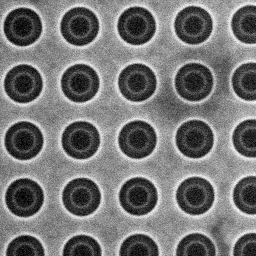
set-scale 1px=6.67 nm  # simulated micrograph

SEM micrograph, an array of small figures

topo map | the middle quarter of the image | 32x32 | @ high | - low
@------@@@@@@@@@-----@@@@@@@@---
--------@@@@@@--------@@@@@@@---
--@@@@---@@@@@---@@@---@@@@@---@
--@@@@---@@@@---@@@@@--@@@@@--@@
-@@@@@@--@@@@---@@@@@--@@@@---@@
-@@@@@@--@@@@---@@@@@--@@@@@--@@
--@@@@---@@@@@--@@@@---@@@@@---@
---@@---@@@@@@--------@@@@@@----
@------@@@@@@@@------@@@@@@@@---
@@----@@@@@@@@@@@--@@@@@@@@@@@@@
@@@@@@@@@@@@@@@@@@@@@@@@@@@@@@@@
@@@@@@@@@@@@@@@@@@@@@@@@@@@@@@@@
@@@@@@@@@@@@@@@@@@@@@@@@@@@@@@@@
@@@@@@@@@@@@@@@@@@@@@@@@@@@@@@@@
@@----@@@@@@@@@@-----@@@@@@@@@--
@-------@@@@@@@-------@@@@@@@---
---@@---@@@@@@---@@@---@@@@@---@
--@@@@---@@@@@--@@@@@--@@@@@--@@
-@@@@@@--@@@@---@@@@@--@@@@@--@@
-@@@@@@--@@@@---@@@@@--@@@@@--@@
--@@@@@--@@@@@--@@@@---@@@@@---@
---@@----@@@@@---------@@@@@@---
@-------@@@@@@@-------@@@@@@@@--
@@----@@@@@@@@@@----@@@@@@@@@@@-
@@@@@@@@@@@@@@@@@@@@@@@@@@@@@@@@
@@@@@@@@@@@@@@@@@@@@@@@@@@@@@@@@
@@@@@@@@@@@@@@@@@@@@@@@@@@@@@@@@
@@@@@@@@@@@@@@@@@@@@@@@@@@@@@@@@
@@@---@@@@@@@@@@@---@@@@@@@@@@@-
@-------@@@@@@@-------@@@@@@@---
--------@@@@@@----@----@@@@@----
--@@@@---@@@@@--@@@@@--@@@@@--@@